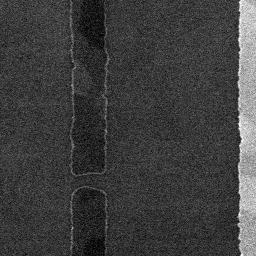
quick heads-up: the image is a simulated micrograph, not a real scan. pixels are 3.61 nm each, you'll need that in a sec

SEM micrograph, one or a few lines or trenches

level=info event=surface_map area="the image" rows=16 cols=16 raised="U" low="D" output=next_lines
DDDDUUUDDDDDDDDU
DDDDUUUDDDDDDDDU
DDDDDUUDDDDDDDDU
DDDDDUUDDDDDDDDU
DDDDDUUDDDDDDDDU
DDDDDUUDDDDDDDDU
DDDDDUUDDDDDDDDU
DDDDDUUDDDDDDDDU
DDDDUUUDDDDDDDDU
DDDDUUUDDDDDDDDU
DDDDUUDDDDDDDDDU
DDDDDDDDDDDDDDDU
DDDDUUUDDDDDDDDU
DDDDUUUDDDDDDDDU
DDDDUUUDDDDDDDDU
DDDDUUUDDDDDDDDU